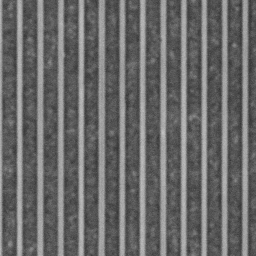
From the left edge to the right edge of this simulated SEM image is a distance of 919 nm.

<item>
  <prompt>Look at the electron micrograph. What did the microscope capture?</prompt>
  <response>parallel lines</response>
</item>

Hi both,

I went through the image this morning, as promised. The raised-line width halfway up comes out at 16.6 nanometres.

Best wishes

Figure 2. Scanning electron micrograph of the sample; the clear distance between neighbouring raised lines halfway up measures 57.4 nanometers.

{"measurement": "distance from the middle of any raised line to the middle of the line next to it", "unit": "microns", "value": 0.0735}